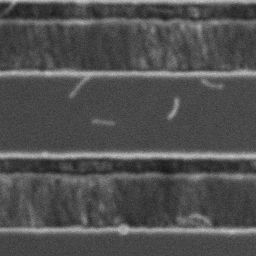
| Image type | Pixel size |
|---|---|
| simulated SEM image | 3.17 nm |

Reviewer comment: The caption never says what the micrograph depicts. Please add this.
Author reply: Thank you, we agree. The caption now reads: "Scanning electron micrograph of lines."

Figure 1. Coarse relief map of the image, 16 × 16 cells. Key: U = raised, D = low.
DDDDDDDDDDDDDDDD
DDDDDDDDDDDDDDDD
DDDDDDDDDDDDDDDD
DDDDDDDDDDDDDDDD
UUUDDDDDUDDDDDDD
UUUUUUUUUUUUUUUU
UUUUUUUUUUUUUUUU
UUUUUUUUUUUUUUUU
UUUUUUUUUUUUUUUU
UUUUUUUUUUUUUUUU
DDDDDDDDDDDDDDDD
DDDDDDDDDDDDDDDD
DDDDDDDDDDDDDDDD
DDDDDDDDDDDDDDDD
UUUUUUUUUUUUUUUU
UUUUUUUUUUUUUUUU